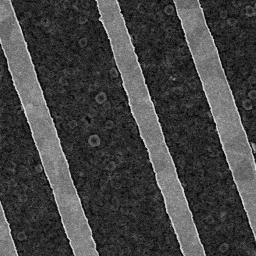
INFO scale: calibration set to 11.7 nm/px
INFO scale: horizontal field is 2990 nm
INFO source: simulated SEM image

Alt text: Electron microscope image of one or a few lines or trenches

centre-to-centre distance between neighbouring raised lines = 1.02 um